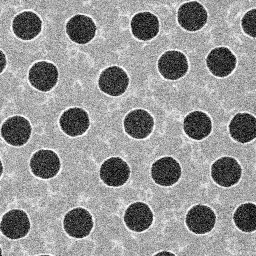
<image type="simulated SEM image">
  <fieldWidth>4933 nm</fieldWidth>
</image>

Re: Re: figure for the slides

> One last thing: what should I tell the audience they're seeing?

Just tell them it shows a regular array of holes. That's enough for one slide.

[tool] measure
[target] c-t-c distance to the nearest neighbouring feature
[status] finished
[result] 993 nanometers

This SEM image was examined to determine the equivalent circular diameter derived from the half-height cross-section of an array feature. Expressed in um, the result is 0.594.